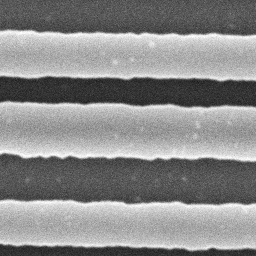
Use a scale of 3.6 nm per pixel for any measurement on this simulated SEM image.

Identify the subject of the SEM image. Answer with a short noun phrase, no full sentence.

lines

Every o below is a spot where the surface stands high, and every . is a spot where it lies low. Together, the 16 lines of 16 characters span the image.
................
................
oooooooooooooooo
oooooooooooooooo
oooooooooooooooo
................
ooo.............
oooooooooooooooo
oooooooooooooooo
oooooooooooooooo
................
................
................
oooooooooooooooo
oooooooooooooooo
...........oooo.